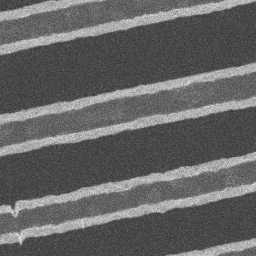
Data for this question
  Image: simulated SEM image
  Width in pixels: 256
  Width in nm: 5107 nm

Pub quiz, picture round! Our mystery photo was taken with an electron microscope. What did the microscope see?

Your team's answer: one or a few lines or trenches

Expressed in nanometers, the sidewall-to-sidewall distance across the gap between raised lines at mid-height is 1140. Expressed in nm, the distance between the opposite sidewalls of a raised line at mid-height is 633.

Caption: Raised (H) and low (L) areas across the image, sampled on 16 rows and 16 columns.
LLHHHHHHHHHHHLLL
HHHHHHHHLLLLLLLL
HHHLLLLLLLLLLLLL
LLLLLLLLLLLLLLLL
LLLLLLLLLLLLLLLH
LLLLLLLLLLHHHHHH
LLLLLHHHHHHHHHHL
HHHHHHHHHHLLLLLL
HHHHHLLLLLLLLLLL
LLLLLLLLLLLLLLLL
LLLLLLLLLLLLLHHH
LLLLLLLLHHHHHHHH
LLLHHHHHHHHHHLLL
HHHHHHHLLLLLLLLL
HHHLLLLLLLLLLLLL
LLLLLLLLLLLLLLHH